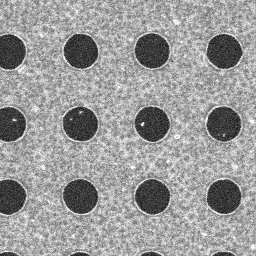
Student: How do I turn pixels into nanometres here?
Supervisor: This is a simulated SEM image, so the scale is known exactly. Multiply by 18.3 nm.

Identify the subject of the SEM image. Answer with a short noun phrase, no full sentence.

a regular array of holes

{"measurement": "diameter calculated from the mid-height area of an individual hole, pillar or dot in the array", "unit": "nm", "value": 655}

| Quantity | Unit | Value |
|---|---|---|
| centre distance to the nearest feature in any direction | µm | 1.31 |